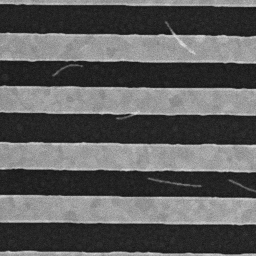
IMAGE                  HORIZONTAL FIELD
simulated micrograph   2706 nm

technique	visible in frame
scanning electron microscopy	lines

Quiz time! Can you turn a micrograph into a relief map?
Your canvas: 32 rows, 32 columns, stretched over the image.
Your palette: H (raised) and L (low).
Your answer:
LHHHHHHHHHHHHHHHHHHHHHHHHHHHHHHH
LLLLLLLLLLLLLLLLLLLLLLLLLLLLLLLL
LLLLLLLLLLLLLLLLLLLLLLLLLLLLLLLL
LLLLLLLLLLLLLLLLLLLLLLLLLLLLLLLL
HHHHHHHHHHHHHHHHHHHHHHHHHHHHHLLL
HHHHHHHHHHHHHHHHHHHHHHHHHHHHHHHH
HHHHHHHHHHHHHHHHHHHHHHHHHHHHHHHH
HHHHHHHHHHHHHHHHHHHHHHHHHHHHHHHH
LLLLLLLLLLLLLLLLLLLLLLLLLLLLLLLL
LLLLLLLLLLLLLLLLLLLLLLLLLLLLLLLL
LLLLLLLLLLLLLLLLLLLLLLLLLLLLLLLL
HHHHHHHHHHHHHHHHHHHHHHHHHHHHHHHH
HHHHHHHHHHHHHHHHHHHHHHHHHHHHHHHH
HHHHHHHHHHHHHHHHHHHHHHHHHHHHHHHH
LLLLLLLLLLLLLLLLLLLLLLLLLLLLLLLL
LLLLLLLLLLLLLLLLLLLLLLLLLLLLLLLL
LLLLLLLLLLLLLLLLLLLLLLLLLLLLLLLL
LLLLLLLLLLLLLLLLLLLLLLLLLLLLLLLL
HHHHHHHHHHHHHHHHHHHHHHHHHHHHHHHH
HHHHHHHHHHHHHHHHHHHHHHHHHHHHHHHH
HHHHHHHHHHHHHHHHHHHHHHHHHHHHHHHH
LLLLLLLLLLLLLLLLLLLLLLLLLLLLLLLH
LLLLLLLLLLLLLLLLLLLLLLLLLLLLLLLL
LLLLLLLLLLLLLLLLLLLLLLLLLLLLLLLL
HHHHHHHHLLLLLLLLLLLLLLLLLLLLLLLL
HHHHHHHHHHHHHHHHHHHHHHHHHHHHHHHH
HHHHHHHHHHHHHHHHHHHHHHHHHHHHHHHH
HHHHHHHHHHHHHHHHHHHHHHHHHHHHHHHH
LLLLLLLLLLLLLLLLLLLLLLLLLLLLLLLL
LLLLLLLLLLLLLLLLLLLLLLLLLLLLLLLL
LLLLLLLLLLLLLLLLLLLLLLLLLLLLLLLL
HHHHHLLLLLLLLLLLLLLLLLLLLLLLLLLL